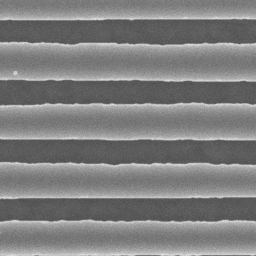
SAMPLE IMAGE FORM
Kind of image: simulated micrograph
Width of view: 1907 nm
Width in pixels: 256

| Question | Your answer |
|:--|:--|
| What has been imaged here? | lines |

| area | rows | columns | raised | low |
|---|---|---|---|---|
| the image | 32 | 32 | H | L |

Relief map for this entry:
HHHHHHHHHHHHHHHHHHHHHHHHHHHHHHHH
HHHHHHHHHHHHHHHHHHHHHHHHHHHHHHHH
LLLLLLLLLLLLLLLLLLLLLLLLLLLLLLLL
LLLLLLLLLLLLLLLLLLLLLLLLLLLLLLLL
LLLLLLLLLLLLLLLLLLLLLLLLLLLLLLLL
HHHHHHHHLLHHHHHLLLLLLLLLLHLHHLLH
HHHHHHHHHHHHHHHHHHHHHHHHHHHHHHHH
HHHHHHHHHHHHHHHHHHHHHHHHHHHHHHHH
HHHHHHHHHHHHHHHHHHHHHHHHHHHHHHHH
HHHHHHHHHHHHHHHHHHHHHHHHHHHHHHHH
LLLLLLLLLLLLLLLLLLLLLLLLLLLLLLLL
LLLLLLLLLLLLLLLLLLLLLLLLLLLLLLLL
LLLLLLLLLLLLLLLLLLLLLLLLLLLLLLLL
HHHHHHHHHHHHHHHHHHHHHHHHHHHHHHHH
HHHHHHHHHHHHHHHHHHHHHHHHHHHHHHHH
HHHHHHHHHHHHHHHHHHHHHHHHHHHHHHHH
HHHHHHHHHHHHHHHHHHHHHHHHHHHHHHHH
LLLLLLLLLLLLLLLLLLLLLLLLLLLLLLLL
LLLLLLLLLLLLLLLLLLLLLLLLLLLLLLLL
LLLLLLLLLLLLLLLLLLLLLLLLLLLLLLLL
HHHHHHHHHHHLHLLLHLLHHHLHHHLLLLLL
HHHHHHHHHHHHHHHHHHHHHHHHHHHHHHHH
HHHHHHHHHHHHHHHHHHHHHHHHHHHHHHHH
HHHHHHHHHHHHHHHHHHHHHHHHHHHHHHHH
HHHHHHHHHHHHHHHHHHHHHHHHHHHHHHHH
LLLLLLLLLLLLLLLLLLLLLLLLLLLLLLLL
LLLLLLLLLLLLLLLLLLLLLLLLLLLLLLLL
LLLLLLLLLLLLLLLLLLLLLLLLLLLLLLLL
HHHHHHHHHHHHHHHHHHHHHHHHHHHHHHHH
HHHHHHHHHHHHHHHHHHHHHHHHHHHHHHHH
HHHHHHHHHHHHHHHHHHHHHHHHHHHHHHHH
HHHHHHHHHHHHHHHHHHHHHHHHHHHHHHHH